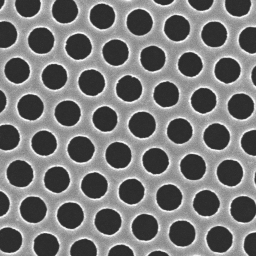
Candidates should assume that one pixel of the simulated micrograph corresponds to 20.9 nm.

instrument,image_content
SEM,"a regular array of holes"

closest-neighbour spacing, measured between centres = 784 nanometres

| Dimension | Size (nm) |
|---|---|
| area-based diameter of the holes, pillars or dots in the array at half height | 560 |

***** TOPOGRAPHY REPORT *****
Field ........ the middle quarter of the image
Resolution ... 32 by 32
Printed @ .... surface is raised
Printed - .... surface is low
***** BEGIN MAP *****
@@@@@@@@@@@@--@@@@@@-----@@@----
@@@@@@--@@@@@@@@@@@@@---@@@@@---
-@@@------@@@@@@@@@@@@@@@@@@@---
-@@@------@@@@----@@@@@@@@@@@@@@
-@@@------@@@------@@@@@---@@@@@
@@@@------@@@------@@@@-----@@@@
@@@@------@@@-------@@-------@@@
@@@@@----@@@@------@@@-------@@@
@@@@@@@@@@@@@@-----@@@-------@@@
---@@@@@@@@@@@@@-@@@@@@-----@@@@
----@@@@@@-@@@@@@@@@@@@@---@@@@@
----@@@@----@@@@@@@@@@@@@@@@@@@@
----@@@------@@@@@----@@@@@@@@@@
----@@@------@@@@------@@@@@@-@@
---@@@@------@@@-------@@@-----@
--@@@@@@-----@@@-------@@@------
@@@@@@@@@---@@@@-------@@@------
@@@@@@@@@@@@@@@@@-----@@@@------
@@----@@@@@@@@@@@@@--@@@@@------
@------@@@@@@-@@@@@@@@@@@@@----@
@-------@@@-----@@@@@@@@@@@@@@@@
@-------@@@------@@@@----@@@@@@@
@------@@@-------@@@------@@@@@-
@@-----@@@-------@@-------@@@@--
@@@---@@@@@------@@@------@@@---
@@@@@@@@@@@@----@@@@------@@@---
-@@@@@@@@@@@@@@@@@@@-----@@@@---
-@@@@@---@@@@@@@@@@@@@--@@@@@@--
-@@@@-----@@@@@@@@@@@@@@@@@@@@--
--@@-------@@@@----@@@@@@@@@@@@@
-@@@-------@@@------@@@@@---@@@@
@@@@-------@@@------@@@------@@@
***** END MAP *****